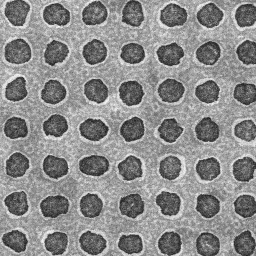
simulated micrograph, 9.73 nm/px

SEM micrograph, a regular array of holes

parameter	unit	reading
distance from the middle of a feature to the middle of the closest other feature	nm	360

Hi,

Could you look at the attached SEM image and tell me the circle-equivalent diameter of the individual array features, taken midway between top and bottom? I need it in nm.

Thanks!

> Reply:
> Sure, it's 242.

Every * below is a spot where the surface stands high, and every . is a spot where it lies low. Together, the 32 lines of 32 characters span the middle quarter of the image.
******.*******************.*****
********************************
********************************
********************************
******....*****...******.....***
*****......***.....****.......**
.****......***......***.......**
.****......***......***.......**
******.....***.....*****......**
*******...*****....******....***
********************************
********************************
********************************
******.**********..*******..****
.****.....*****.....****....****
.***.......***......****.....***
.***.......***......***.......**
****.......***......***......***
*****.....*****....*****.....***
***************..********...****
********************************
********************************
********************************
****.......****...******.....***
.***.......***......****......**
.***.......**.......****......**
.***.......**.......****......**
.****.....***.......****.....***
**************....*******...****
********************************
********************************
********************************